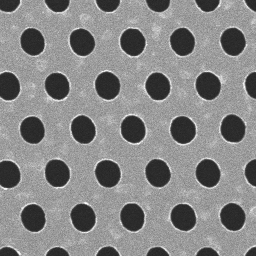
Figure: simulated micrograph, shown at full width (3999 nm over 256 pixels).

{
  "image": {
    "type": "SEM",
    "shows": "a regular array of holes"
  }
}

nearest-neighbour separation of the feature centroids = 775 nanometers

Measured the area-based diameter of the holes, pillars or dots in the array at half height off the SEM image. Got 403 nm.